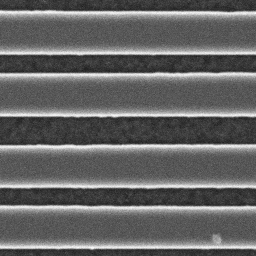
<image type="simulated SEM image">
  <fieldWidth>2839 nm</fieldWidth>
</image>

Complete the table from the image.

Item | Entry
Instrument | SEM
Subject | lines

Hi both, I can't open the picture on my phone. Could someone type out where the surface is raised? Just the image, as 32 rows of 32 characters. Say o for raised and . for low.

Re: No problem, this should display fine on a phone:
................................
oooooooooooooo.oooo......o......
oooooooooooooooooooooooooooooooo
oooooooooooooooooooooooooooooooo
oooooooooooooooooooooooooooooooo
oooooooooooooooooooooooooooooooo
oooooooooooooooooooooooooooooooo
................................
................................
oooooooooooooooooooooooooooooooo
oooooooooooooooooooooooooooooooo
oooooooooooooooooooooooooooooooo
oooooooooooooooooooooooooooooooo
oooooooooooooooooooooooooooooooo
................................
................................
................................
................................
oooooooooooooooooooooooooooooooo
oooooooooooooooooooooooooooooooo
oooooooooooooooooooooooooooooooo
oooooooooooooooooooooooooooooooo
oooooooooooooooooooooooooooooooo
................................
................................
................................
oooooooooooooooooooooooooooooooo
oooooooooooooooooooooooooooooooo
oooooooooooooooooooooooooooooooo
oooooooooooooooooooooooooooooooo
oooooooooooooooooooooooooooooooo
................................